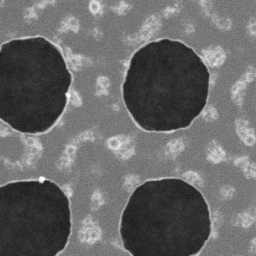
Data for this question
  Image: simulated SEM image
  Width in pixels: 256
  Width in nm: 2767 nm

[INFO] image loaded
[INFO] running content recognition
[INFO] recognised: holes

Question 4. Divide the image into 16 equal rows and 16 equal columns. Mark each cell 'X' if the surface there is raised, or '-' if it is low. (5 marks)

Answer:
XXXXXXXXXXXXXXXX
XXXXXXXXXXXXXXXX
X--XXXXXXX-XXXXX
----XXXX----XXXX
----XXXX-----XXX
----XXXX-----XXX
----XXXX-----XXX
----XXXX----XXXX
XXXXXXXXXXXXXXXX
XXXXXXXXXXXXXXXX
XXXXXXXXXXXXXXXX
X--XXXXXX---XXXX
----XXXX-----XXX
----XXXX-----XXX
----XXXX-----XXX
----XXXX-----XXX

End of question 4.